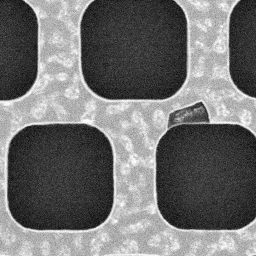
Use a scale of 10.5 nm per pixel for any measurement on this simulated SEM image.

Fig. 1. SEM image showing holes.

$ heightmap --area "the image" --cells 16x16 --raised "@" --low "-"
--@@@------@@@@-
--@@@-------@@--
--@@@-------@@--
--@@@-------@@--
--@@@-------@@--
--@@@@-----@@@@-
@@@@@@@@@@@@@@@@
@@@@@@@@@@@--@@@
@------@@@------
-------@@@------
-------@@@------
-------@@@------
-------@@@------
@------@@@------
@@@@@@@@@@@@@@@@
@@@@@@@@@@@@@@@@